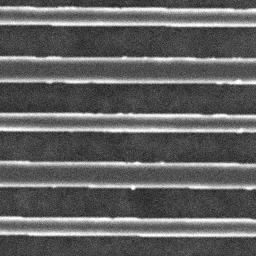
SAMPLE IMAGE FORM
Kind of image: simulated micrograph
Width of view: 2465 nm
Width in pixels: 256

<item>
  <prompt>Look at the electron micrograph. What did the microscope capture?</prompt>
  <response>lines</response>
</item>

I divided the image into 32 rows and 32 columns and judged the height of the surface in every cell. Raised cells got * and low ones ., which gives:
................................
********************************
********************************
................................
................................
................................
................................
********************************
********************************
********************************
................................
................................
................................
................................
********************************
********************************
................................
................................
................................
................................
******************************..
********************************
********************************
...............................*
................................
................................
................................
********************************
********************************
................................
................................
................................